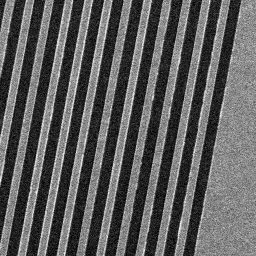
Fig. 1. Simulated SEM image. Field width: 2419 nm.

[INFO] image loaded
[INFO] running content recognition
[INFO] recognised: parallel lines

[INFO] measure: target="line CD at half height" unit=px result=7.86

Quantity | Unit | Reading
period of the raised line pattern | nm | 182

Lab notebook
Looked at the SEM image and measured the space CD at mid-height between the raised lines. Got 108 nanometers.